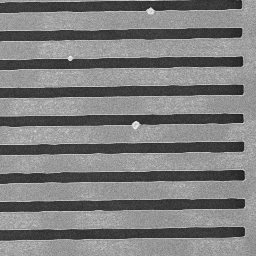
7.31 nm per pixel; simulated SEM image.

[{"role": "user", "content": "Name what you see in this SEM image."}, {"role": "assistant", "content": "groups of lines, slits or small figures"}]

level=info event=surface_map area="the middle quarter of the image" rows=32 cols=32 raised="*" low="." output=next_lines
................................
********************************
********************************
********************************
********************************
*************...................
................................
................................
********************************
********************************
********************************
********************************
****************************....
................................
................................
.........***********************
********************************
********************************
********************************
********************............
................................
................................
........*.....******************
********************************
********************************
********************************
********************************
................................
................................
...............................*
********************************
********************************